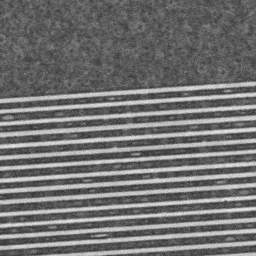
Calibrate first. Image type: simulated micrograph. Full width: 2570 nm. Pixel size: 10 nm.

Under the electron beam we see parallel lines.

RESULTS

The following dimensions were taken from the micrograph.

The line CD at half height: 38.8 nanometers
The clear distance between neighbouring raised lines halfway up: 77.6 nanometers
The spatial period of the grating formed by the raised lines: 114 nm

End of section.